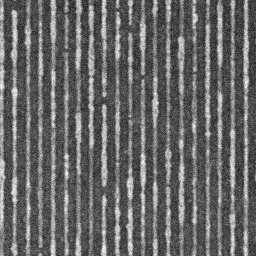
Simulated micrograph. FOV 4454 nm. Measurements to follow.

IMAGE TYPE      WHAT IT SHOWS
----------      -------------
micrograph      parallel lines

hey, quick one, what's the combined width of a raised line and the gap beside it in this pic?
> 224 nm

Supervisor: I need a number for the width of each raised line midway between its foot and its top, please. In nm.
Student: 47.8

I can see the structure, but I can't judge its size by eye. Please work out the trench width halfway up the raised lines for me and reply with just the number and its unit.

174 nm